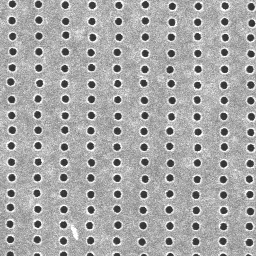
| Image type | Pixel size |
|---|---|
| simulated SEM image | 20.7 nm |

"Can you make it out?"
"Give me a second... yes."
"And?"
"a regular array of holes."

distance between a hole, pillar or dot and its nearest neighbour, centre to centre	15.4	px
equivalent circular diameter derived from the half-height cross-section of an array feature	157	nanometers